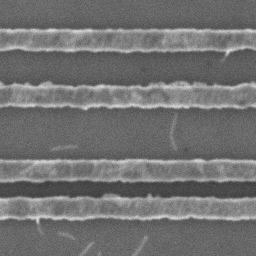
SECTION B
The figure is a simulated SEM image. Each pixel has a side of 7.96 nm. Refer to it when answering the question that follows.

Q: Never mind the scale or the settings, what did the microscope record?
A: lines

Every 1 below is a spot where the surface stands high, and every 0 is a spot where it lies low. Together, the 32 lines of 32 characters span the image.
00000000000000000000000000000000
00000000000000000000000000000000
00000000000000000000000000000000
00000000000000000000000000000000
11111111111111111111111111111111
11111111111111111111111111111111
00000000000000010000000000000000
00000000000000000000000000000000
00000000000000000000000000000000
00000000000000000000000000000000
00000000000000000000000000000000
11111111111111111111111111111111
11111111111111111111111111111111
00000000001000000000000000000000
00000000000000000000000000000000
00000000000000000000000000000000
00000000000000000000000000000000
00000000000000000000000000000000
00000000000000000000000000000000
00000000000000000000000000000000
11111111111111111111111111111111
11111111111111111111111111111111
11011110100111111111111011011111
00000000000000000000000000000000
00000000000000000000000000000000
11111111111111111111111111111111
11111111111111111111111111111111
00000000000000000000000000000000
00000000000000000000000000000000
00000000000000000000000000000000
00000000000000000000000000000000
00000000000000000000000000000000